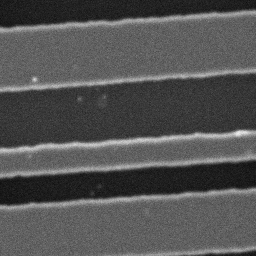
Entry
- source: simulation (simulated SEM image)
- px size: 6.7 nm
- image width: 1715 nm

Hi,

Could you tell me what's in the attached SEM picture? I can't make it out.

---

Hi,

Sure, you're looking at lines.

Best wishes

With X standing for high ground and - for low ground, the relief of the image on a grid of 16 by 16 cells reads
----------------
----XXXXXXXXXXXX
XXXXXXXXXXXXXXXX
XXXXXXXXXXXXXXXX
XXXXXXXXXXXXXXXX
XX--------------
----------------
----------------
------------XXXX
XXXXXXXXXXXXXXXX
XXXXXXXX--------
----------------
------XXXXXXXXXX
XXXXXXXXXXXXXXXX
XXXXXXXXXXXXXXXX
XXXXXXXXXXXXXXXX